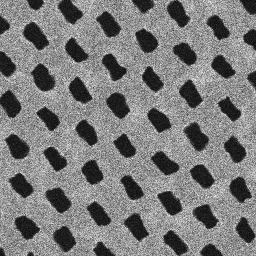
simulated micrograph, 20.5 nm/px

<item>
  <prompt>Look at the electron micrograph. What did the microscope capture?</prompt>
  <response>a regular array of holes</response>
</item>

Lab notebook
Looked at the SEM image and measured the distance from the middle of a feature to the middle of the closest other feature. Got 807 nm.